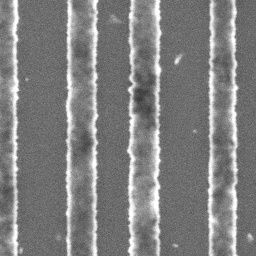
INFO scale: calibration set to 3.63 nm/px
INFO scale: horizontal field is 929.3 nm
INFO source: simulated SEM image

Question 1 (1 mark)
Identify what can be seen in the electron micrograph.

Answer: lines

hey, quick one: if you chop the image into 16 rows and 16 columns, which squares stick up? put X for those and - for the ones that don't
X---XX--XX---XX-
X---XX--XX---XX-
X---XX--XX---XX-
X---XX--XX---XX-
X---XX--XX---XX-
X---XX--XX---XX-
X---XX--XX---XX-
X---XX--XX---XX-
X---XX--XX---XX-
X---XX--XX---XX-
X---XX--XX---XX-
X---XX--XX---XX-
X---XX--XX---XX-
X---XX--XX---XX-
X---XX--XX---XX-
X---XX--XX---XX-